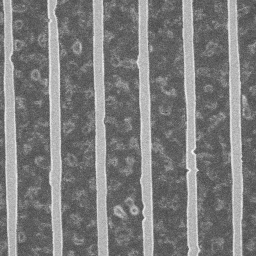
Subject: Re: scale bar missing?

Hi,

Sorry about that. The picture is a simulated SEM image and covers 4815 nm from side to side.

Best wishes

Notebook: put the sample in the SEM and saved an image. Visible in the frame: parallel lines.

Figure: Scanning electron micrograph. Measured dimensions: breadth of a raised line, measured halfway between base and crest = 0.162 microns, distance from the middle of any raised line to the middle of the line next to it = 0.848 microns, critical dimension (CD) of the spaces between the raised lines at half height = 684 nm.